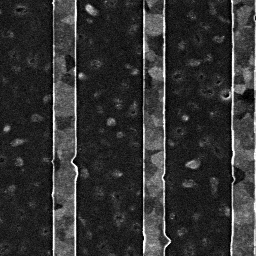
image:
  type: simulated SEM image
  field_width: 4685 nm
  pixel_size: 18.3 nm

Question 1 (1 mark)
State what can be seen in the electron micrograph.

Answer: one or a few lines or trenches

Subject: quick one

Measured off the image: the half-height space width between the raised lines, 1230 nanometres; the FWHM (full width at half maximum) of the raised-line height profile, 416 nanometres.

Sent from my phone